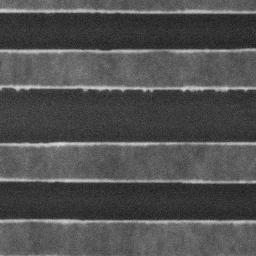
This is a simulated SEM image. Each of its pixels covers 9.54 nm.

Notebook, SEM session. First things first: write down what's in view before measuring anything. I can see lines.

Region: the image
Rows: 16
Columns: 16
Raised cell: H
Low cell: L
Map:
HHHHHHHHHHHHHHHH
LLLLLLLLLLLLLLLL
LLLLLLLLLLLLLLLL
HHHHHHHHHHHHHHHH
HHHHHHHHHHHHHHHH
LLLLLLHHHHHHHHHH
LLLLLLLLLLLLLLLL
LLLLLLLLLLLLLLLL
LLLLLLLLLLLLLLLL
HHHHHHHHHHHHHHHH
HHHHHHHHHHHHHHHH
LLLLLLLLLLLLLLLL
LLLLLLLLLLLLLLLL
LLLLLLLLLLLLLLLL
HHHHHHHHHHHHHHHH
HHHHHHHHHHHHHHHH